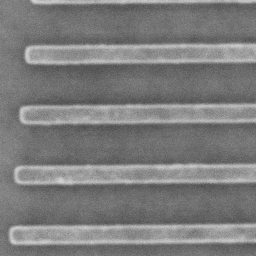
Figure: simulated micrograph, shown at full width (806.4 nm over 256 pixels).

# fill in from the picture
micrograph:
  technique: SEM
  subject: groups of lines, slits or small figures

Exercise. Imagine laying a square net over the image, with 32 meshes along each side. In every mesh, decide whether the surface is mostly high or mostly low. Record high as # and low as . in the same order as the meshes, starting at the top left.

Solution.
................................
................................
................................
................................
................................
................................
...#############################
....############################
................................
................................
................................
................................
................................
...#############################
...#############################
................................
................................
................................
................................
................................
................................
..##############################
..##############################
................................
................................
................................
................................
................................
..##############################
.###############################
................................
................................